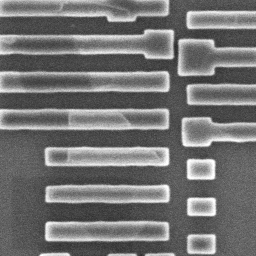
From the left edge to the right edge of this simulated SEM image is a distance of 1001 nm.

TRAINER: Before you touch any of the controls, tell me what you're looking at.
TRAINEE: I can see wiring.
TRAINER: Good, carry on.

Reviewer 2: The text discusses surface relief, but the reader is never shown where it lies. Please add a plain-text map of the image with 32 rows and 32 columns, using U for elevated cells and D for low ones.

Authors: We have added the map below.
UUUUUUUUUUUUUUUUUUUUUDDDDDDDDDDD
UUUUUUUUUUUUUUUUUUUUUDDDDDDDDDDD
DDDDDDDDDDDDDDUUDDDDDDDDUUUUUUUU
DDDDDDDDDDDDDDDDDDDDDDDDDDDDDDDD
UUUUUUUUUUDUUUDUUUUUUUDDDDDDDDDD
UUUUUUUUUUUUUUUUUUUUUUUUUUUDDDDD
UUUUUUUUUUUUUUUUUUUUUUUUUUUUUUUU
DDDDDDDDDDDDDDDDDDDDDDUUUUUUUUUU
DDDDDDDDDDDDDDDDDDDDDDUUUUUDDDDD
UUUUUUUUUUUUUUUUUUUUUDDDDDDDDDDD
UUUUUUUUUUUUUUUUUUUUUDDDDDDDDDDD
DDDDDDDDDDDDDDDDDDDDDDDDUUUUUUUU
DDDDDDDDDDDDDDDDDDDDDDDDUUUUUUUU
DDDDDDDDDDDDDDDDDDDDDDDDDDDDDDDD
UUUUUUUUUUUUUUUUUUUUUDDDDDDDDDDD
UUUUUUUUUUUUUUUUUUUUUDDUUUUDDUUU
DDDDDDDDDDDDDDDDDDDDDDDUUUUUUUUU
DDDDDDDDDDDDDDDDDDDDDDDUUUUUUUUU
DDDDDDDDDDDDDDDDDDDDDDDDDDDDDDDD
DDDDDDUUUUUUUUUUUUUUUDDDDDDDDDDD
DDDDDDUUUUUUUUUUUUUUUDDDUUUDDDDD
DDDDDDDDDDDDDDDDDDDDDDDDUUUDDDDD
DDDDDDDDDDDDDDDDDDDDDDDDDDDDDDDD
DDDDDDUUUUUUUUUUUUUUUDDDDDDDDDDD
DDDDDDUUUUUUUUUUUUUUUDDDDDDDDDDD
DDDDDDDDDDDDDDDDDDDDDDDDUUUDDDDD
DDDDDDDDDDDDDDDDDDDDDDDDUUUDDDDD
DDDDDDDDDDDDDDDDDDDDDDDDDDDDDDDD
DDDDDDUUUUUUUUUUUUUUUDDDDDDDDDDD
DDDDDDUUUUUUUUUUUUUUUDDDUDDDDDDD
DDDDDDDDDDDDDDDDDDDDDDDDUUUDDDDD
DDDDDDDDDDDDDDDDDDDDDDDDUUDDDDDD